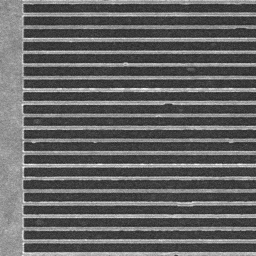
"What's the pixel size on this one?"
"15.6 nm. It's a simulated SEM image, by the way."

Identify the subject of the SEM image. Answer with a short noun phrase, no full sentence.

parallel lines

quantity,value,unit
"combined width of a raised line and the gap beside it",196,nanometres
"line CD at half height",0.0468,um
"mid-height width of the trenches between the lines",152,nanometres